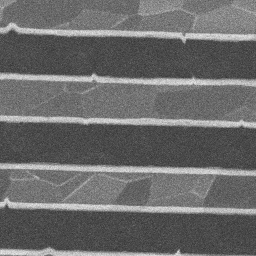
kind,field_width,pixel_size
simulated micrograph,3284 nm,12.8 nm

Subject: one or a few lines or trenches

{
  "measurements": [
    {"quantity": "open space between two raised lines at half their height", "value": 611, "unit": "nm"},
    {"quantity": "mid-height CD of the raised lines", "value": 506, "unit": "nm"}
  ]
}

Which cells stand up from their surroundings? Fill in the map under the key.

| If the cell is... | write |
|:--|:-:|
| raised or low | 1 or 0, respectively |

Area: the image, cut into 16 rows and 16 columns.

1111111111111111
1111111111111111
0000000000000000
0000000000000000
0000000000000000
1111111111111111
1111111111111111
0000011111111111
0000000000000000
0000000000000000
1111000000000000
1111111111111111
1111111111111111
0000000000000000
0000000000000000
0000000000000000